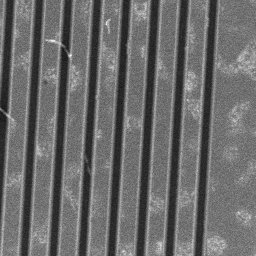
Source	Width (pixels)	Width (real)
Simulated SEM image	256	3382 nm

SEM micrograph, parallel lines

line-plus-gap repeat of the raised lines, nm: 383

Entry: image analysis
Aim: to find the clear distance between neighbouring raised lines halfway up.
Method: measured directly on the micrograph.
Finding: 132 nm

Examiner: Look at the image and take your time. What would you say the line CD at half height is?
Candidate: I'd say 249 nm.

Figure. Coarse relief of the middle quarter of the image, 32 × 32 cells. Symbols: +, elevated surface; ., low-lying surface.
..++++...++++...++++...+++++...+
.+++++...++++...++++...+++++...+
.+++++...++++...++++...+++++..++
.+++++...++++...++++...++++...++
.+++++..+++++...++++...++++...++
.+++++..+++++...++++...++++...++
.+++++..+++++...++++...++++...++
.+++++..+++++...++++...++++...++
.+++++..+++++..+++++...++++...++
.++++...+++++..+++++...++++...++
.++++...+++++..+++++...++++...++
.++++...+++++..+++++..+++++...++
.++++...+++++..+++++..+++++...++
.++++...++++...+++++..+++++...++
.++++...++++...+++++..+++++...++
.++++...++++...+++++..+++++..+++
.++++...++++...++++...+++++..+++
+++++...++++...++++...+++++..+++
+++++...++++...++++...+++++..+++
+++++...++++...++++...+++++..+++
+++++...++++...++++...++++...+++
+++++..+++++...++++...++++...+++
+++++..+++++...++++...++++...+++
+++++..+++++...++++...++++...+++
+++++..+++++..+++++...++++...+++
+++++..+++++..+++++...++++...+++
++++...+++++..+++++...++++...+++
++++...+++++..+++++...++++...+++
++++...+++++..+++++..+++++...+++
++++...+++++..+++++..+++++...+++
++++...++++...+++++..+++++...+++
++++...++++...+++++..+++++...+++